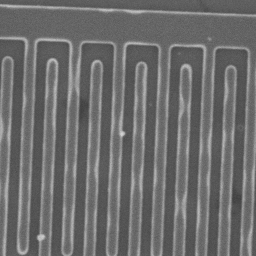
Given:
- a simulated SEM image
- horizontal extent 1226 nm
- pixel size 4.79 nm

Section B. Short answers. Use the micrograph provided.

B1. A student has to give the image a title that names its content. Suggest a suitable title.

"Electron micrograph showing groups of lines, slits or small figures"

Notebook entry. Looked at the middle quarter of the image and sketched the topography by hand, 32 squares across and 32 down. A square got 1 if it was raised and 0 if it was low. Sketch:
00110001110011100011000011000010
00110001110011100011000011000111
00110001110011100011000011000111
00110001110011100011000011000111
00100001100011100011000011000111
00100001100011100011000011000111
01110001100011100011000011000111
01110001100011100011000011000111
01110001100011100011000111000111
01110001100011100011000111000111
01110001100011100011000111000110
01110001100011100011000111000110
01110001100011000011000111000110
01100011100011000011000111000110
01100011100011000011000111000110
01100001100011000011000111000110
01100011100011000011000111000110
01100011100011100111000111000110
01100011100011000111000111000110
01100011100011000111000111000110
01100011100011000111000111000110
11100011100011000111000110000110
11100011100011000111000110001110
11100011100011000111000110001110
11100011000011000111000110001110
11100011000011000111000110001110
11100011000011000111000110001110
11100011000011000110000110001110
11100011000011000110000110001110
11100011000111000110000110001110
11100011000111000110001110001110
11100011000111000110001110001110